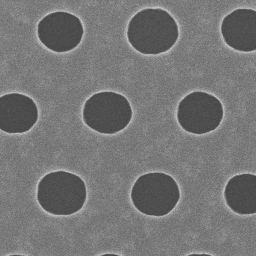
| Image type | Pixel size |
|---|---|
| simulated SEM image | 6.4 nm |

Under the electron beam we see holes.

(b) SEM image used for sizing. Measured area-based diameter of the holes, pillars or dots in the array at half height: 292 nanometers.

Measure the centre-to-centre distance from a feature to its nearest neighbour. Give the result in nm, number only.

592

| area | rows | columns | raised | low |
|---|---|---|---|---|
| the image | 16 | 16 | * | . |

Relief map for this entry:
****************
**...***...***..
***..***...***..
****************
****************
****************
..***...***...**
..***...***...**
****************
****************
****************
**...***...***..
**...***...***..
****************
****************
****************